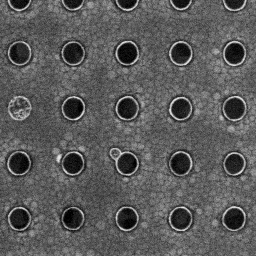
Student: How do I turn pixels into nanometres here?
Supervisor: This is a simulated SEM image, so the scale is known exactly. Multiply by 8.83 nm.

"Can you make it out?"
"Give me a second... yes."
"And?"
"a regular array of raised bodies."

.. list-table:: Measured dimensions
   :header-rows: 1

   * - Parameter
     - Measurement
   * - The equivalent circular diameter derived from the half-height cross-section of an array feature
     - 202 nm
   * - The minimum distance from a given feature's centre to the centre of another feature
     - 473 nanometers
